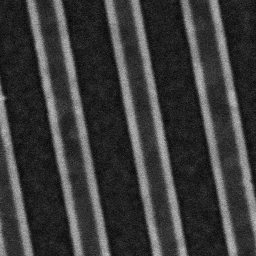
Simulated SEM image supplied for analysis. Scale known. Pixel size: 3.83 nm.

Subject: one or a few lines or trenches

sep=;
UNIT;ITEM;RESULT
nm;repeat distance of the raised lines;291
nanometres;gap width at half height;188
